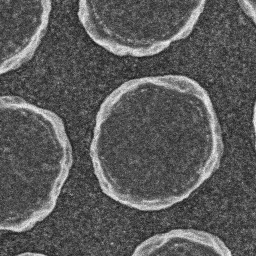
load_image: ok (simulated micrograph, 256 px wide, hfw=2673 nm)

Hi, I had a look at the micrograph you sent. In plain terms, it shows raised bodies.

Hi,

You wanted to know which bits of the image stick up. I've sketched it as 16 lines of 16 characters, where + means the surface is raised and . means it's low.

+++..+++++++....
+++..+++++++....
++....+++++.....
+...............
................
........++++....
+......++++++...
+++...+++++++...
++++..+++++++...
++++..+++++++...
++++..+++++++...
++++...+++++....
+++.....+++.....
++..............
................
.........+++++..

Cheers